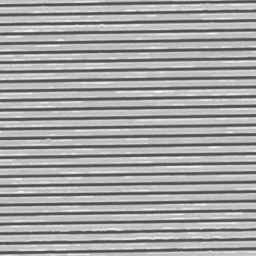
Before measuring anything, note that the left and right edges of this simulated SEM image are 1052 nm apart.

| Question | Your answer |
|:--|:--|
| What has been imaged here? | parallel lines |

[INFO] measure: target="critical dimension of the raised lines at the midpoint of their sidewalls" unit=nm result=25.2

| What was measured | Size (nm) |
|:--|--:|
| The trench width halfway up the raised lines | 13.9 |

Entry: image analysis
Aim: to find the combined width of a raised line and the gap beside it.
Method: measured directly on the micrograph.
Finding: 0.0391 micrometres